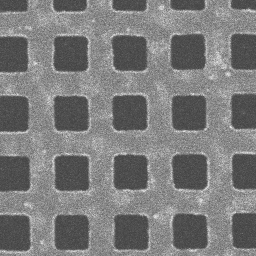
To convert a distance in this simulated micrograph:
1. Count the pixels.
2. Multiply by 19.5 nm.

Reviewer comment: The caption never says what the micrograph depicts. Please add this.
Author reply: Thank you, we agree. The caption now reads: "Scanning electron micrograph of a regular array of holes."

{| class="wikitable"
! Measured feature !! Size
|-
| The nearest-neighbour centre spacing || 58.6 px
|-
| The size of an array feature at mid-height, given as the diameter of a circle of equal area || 756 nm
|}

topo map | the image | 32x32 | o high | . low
....ooo....ooo....ooo.....ooo...
.o.ooooooooooooooooooooooooooooo
oooooooooooooooooooooooooooooooo
oooooooooooooooooooooooooooooooo
ooooooooo.ooooo...oooo...oooo...
....ooo....ooo....ooo.....ooo...
...oooo....ooo....ooo.....ooo...
....ooo....ooo....ooo.....ooo...
...oooo....ooo....oooo...oooo...
oooooooooooooooooooooooooooooooo
oooooooooooooooooooooooooooooooo
oooooooooooooooooooooooooooooooo
...oooo....ooo....oooo....ooo...
....ooo....ooo....ooo.....ooo...
....ooo....ooo....ooo.....ooo...
....ooo....ooo....ooo.....ooo...
...ooooooooooooooooooooooooooooo
oooooooooooooooooooooooooooooooo
oooooooooooooooooooooooooooooooo
.oooooo....oooo...oooo....ooo...
....ooo....ooo....oooo....ooo...
....ooo....ooo....oooo....ooo...
....ooo....ooo.....ooo....ooo...
....ooo....oooo...oooo....ooo...
oooooooooooooooooooooooooooooooo
oooooooooooooooooooooooooooooooo
oooooooooooooooooooooooooooooooo
....ooo....ooo....oooo....ooo...
....ooo....ooo.....ooo....ooo...
....ooo....ooo.....ooo....ooo...
....ooo....ooo.....ooo....ooo...
oooooooooooooooooooooooooooooooo